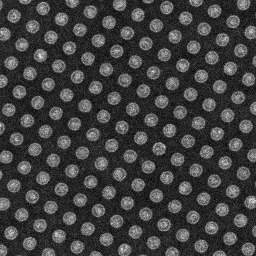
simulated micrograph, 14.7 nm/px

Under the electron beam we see a regular array of raised bodies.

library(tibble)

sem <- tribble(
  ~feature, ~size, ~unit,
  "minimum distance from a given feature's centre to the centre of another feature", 308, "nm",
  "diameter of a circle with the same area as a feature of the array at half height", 186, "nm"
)